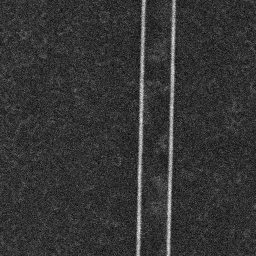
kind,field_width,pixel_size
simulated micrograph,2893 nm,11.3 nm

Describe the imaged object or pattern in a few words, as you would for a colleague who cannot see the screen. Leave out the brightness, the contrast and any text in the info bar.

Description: one or a few lines or trenches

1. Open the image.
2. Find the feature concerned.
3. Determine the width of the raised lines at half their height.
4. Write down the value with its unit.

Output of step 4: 350 nm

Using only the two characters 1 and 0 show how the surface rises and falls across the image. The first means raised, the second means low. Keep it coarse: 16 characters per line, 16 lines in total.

0000000001100000
0000000001100000
0000000001100000
0000000001100000
0000000001100000
0000000001100000
0000000001100000
0000000001100000
0000000001100000
0000000001100000
0000000001100000
0000000001100000
0000000001100000
0000000001100000
0000000001100000
0000000001100000